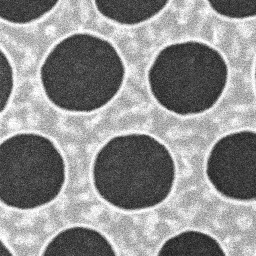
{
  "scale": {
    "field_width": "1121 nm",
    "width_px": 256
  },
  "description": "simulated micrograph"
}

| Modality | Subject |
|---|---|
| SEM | holes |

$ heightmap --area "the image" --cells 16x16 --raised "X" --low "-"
---XXX----XXX---
XXXXXXXX-XXXXXXX
XXXX---XXXXXXXXX
XXX----XXX----XX
-XX-----X-----XX
-XX-----X-----XX
XXX----XXX---XXX
XXXXXXXXXXXXXXXX
X--XXXX--XXXXX--
----XX-----XX---
----XX-----XX---
----XX-----XX---
---XXXX---XXXXX-
XXXXXXXXXXXXXXXX
XXXX--XXXXXXXXXX
XXX----XXX----XX